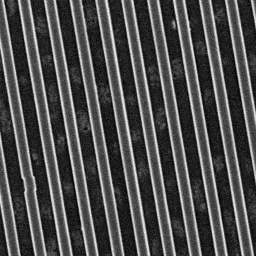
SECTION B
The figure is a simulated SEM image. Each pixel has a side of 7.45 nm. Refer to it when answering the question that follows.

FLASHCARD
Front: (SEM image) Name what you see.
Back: parallel lines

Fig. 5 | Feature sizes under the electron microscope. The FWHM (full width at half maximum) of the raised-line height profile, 78.1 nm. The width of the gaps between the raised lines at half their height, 0.113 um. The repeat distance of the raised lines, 0.19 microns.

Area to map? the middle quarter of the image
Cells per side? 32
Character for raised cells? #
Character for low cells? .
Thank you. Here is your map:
#...###....##....###....##....##
#...###....###....##....###...##
#....##....###....##....###....#
#....###...###....##....###....#
#....###...###....###...###....#
#....###....##....###...###....#
##....##....##....###....##....#
##....##....###....##....###...#
##....##....###....##....###....
##....###...###....##....###....
##....###...###....###...###....
##....###....##....###...###....
###....##....##....###....##....
###....##....###....##....###...
###....##....###....##....###...
###....###...###....##....###...
.##....###...###....###...###...
.##....###....##....###...###...
.###....##....##....###....##...
.###....##....###...###....###..
.###....##....###...###....###..
.###....###...###....##....###..
.###....###....##....###...###..
..##....###....##....###....##..
..###...###....##....###....##..
..###...###....###....##....###.
..###....##....###....##....###.
...##....###...###....##....###.
...##....###....##....###...###.
...##....###....##....###....##.
...###...###....##....###....##.
...###....##....###....##....###